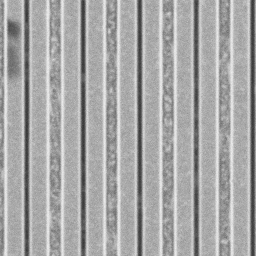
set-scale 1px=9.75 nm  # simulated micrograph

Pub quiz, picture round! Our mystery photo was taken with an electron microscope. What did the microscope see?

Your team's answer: parallel lines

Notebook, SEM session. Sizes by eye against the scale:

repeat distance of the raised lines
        0.276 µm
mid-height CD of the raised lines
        188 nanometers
